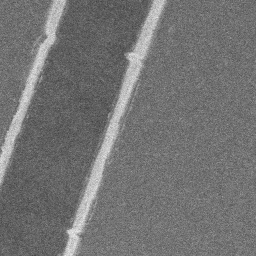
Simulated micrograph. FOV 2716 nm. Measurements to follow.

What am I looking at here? one or a few lines or trenches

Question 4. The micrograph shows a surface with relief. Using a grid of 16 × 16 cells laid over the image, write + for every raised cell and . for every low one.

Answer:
++++......++++++
+++......+++++++
+++......+++++++
+++......+++++++
++......++++++++
++......++++++++
+.......++++++++
+......+++++++++
+......+++++++++
.......+++++++++
......++++++++++
......++++++++++
.....+++++++++++
.....+++++++++++
.....+++++++++++
....++++++++++++